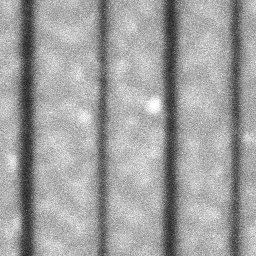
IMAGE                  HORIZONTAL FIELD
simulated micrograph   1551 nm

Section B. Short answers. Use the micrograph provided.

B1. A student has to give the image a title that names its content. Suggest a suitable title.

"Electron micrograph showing one or a few lines or trenches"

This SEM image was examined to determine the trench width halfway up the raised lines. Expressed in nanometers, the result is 308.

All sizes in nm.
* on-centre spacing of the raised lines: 421